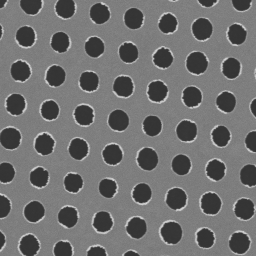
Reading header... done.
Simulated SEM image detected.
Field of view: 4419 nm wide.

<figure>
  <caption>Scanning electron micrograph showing a regular array of holes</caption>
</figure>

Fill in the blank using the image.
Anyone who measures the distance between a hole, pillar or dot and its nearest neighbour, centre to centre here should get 588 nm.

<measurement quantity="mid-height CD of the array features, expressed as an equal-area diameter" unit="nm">344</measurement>